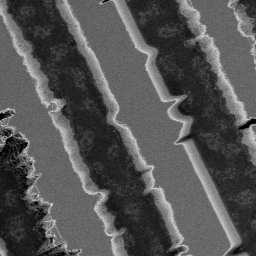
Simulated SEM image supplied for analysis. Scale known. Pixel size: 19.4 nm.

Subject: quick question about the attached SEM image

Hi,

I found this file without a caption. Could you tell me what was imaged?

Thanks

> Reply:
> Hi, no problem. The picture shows one or a few lines or trenches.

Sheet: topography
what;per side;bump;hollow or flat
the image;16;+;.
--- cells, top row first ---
....++++....+++.
+....+++....+++.
+....++++....+++
++....+++....+++
++....++++....++
+++...++++....++
++++...++++....+
++++...++++....+
++++....++++....
.++++...++++....
..+++....+++....
..+++....++++...
..++++....+++...
...++++...++++..
...++++....+++..
....+++....++++.